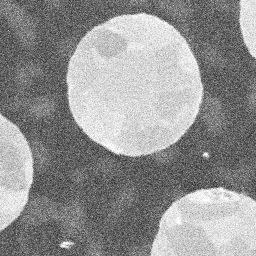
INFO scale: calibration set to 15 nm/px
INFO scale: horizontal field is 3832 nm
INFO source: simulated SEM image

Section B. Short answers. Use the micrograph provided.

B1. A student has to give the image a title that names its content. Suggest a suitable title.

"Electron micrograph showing raised bodies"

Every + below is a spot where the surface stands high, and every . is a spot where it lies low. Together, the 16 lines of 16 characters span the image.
...............+
......++++.....+
.....++++++....+
.....+++++++....
....++++++++....
....+++++++++...
....++++++++....
.....+++++++....
+.....+++++.....
++.....+++......
++..............
++..............
++.........+++++
+.........++++++
..........++++++
..........++++++